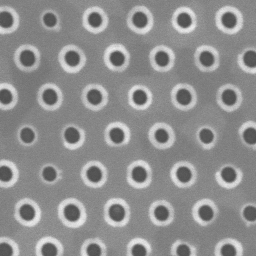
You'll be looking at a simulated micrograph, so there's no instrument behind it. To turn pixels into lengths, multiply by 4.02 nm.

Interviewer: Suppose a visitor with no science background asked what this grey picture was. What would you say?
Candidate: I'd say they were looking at a regular array of holes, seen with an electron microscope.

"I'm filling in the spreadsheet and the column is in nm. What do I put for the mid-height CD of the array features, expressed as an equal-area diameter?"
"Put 67.9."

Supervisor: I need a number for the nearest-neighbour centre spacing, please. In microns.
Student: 0.178